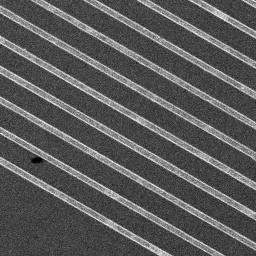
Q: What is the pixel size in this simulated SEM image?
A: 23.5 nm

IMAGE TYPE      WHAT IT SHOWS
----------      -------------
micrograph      parallel lines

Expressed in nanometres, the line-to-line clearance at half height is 482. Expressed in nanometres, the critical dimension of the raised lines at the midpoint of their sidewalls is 135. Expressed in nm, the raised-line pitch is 617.